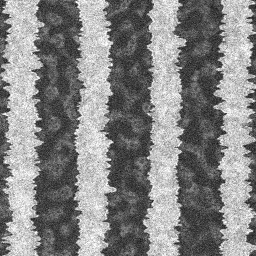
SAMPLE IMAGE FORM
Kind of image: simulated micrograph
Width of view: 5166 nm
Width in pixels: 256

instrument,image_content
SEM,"one or a few lines or trenches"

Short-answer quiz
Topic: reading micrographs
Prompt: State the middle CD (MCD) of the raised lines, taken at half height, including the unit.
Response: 552 nanometres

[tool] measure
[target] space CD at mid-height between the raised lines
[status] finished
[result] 875 nanometers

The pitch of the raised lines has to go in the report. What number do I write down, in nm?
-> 1450